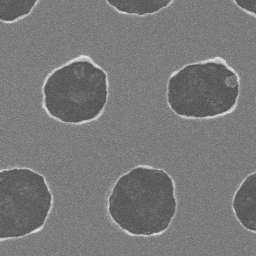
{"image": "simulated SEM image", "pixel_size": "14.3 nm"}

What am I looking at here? holes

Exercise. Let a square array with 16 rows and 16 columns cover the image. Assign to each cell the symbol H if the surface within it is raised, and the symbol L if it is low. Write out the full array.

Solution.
LLHHHHHLLLHHHHHL
HHHHHHHHHHHHHHHH
HHHHHHHHHHHHHHHH
HHHHHHHHHHHHHHHH
HHHLLLHHHHHLLLLH
HHHLLLLHHHHLLLLH
HHHLLLLHHHHLLLLH
HHHHLHHHHHHHHHHH
HHHHHHHHHHHHHHHH
HHHHHHHHHHHHHHHH
HHHHHHHHHHHHHHHH
LLLHHHHLLLLHHHHL
LLLHHHHLLLLHHHHL
LLLHHHHLLLLHHHHL
LLHHHHHHLLHHHHHH
HHHHHHHHHHHHHHHH